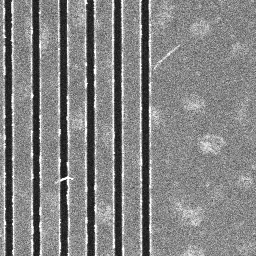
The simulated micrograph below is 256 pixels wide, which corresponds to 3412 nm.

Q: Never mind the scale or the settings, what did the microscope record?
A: parallel lines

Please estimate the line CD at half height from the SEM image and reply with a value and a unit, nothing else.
272 nm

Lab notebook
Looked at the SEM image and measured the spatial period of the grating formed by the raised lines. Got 364 nanometres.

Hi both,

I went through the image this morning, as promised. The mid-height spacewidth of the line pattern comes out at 93.3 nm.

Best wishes